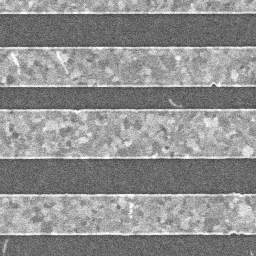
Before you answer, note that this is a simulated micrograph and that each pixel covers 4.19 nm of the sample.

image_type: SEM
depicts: one or a few lines or trenches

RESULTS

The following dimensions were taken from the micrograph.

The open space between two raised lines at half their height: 0.143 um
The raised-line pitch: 309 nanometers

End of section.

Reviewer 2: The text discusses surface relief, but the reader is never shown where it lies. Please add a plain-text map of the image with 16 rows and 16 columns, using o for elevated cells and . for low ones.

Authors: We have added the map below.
oooooooooooooooo
................
................
oooooooooooooooo
oooooooooooooooo
................
................
oooooooooooooooo
oooooooooooooooo
oooooooooooooooo
................
................
oooooooooooooooo
oooooooooooooooo
oooooooooooooooo
................